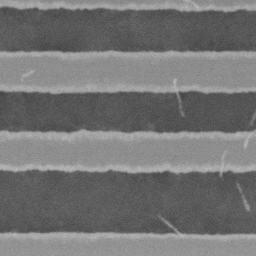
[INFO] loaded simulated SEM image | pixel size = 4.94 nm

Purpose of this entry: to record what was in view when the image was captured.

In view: lines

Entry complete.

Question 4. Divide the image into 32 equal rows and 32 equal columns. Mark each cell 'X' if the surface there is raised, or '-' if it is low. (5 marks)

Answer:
XXXXXXXXXXXXXXXXXXXXXXXXXXXXXXXX
--------------------------------
--------------------------------
--------------------------------
--------------------------------
--------------------------------
-----XXX-----XX------X------X---
XXXXXXXXXXXXXXXXXXXXXXXXXXXXXXXX
XXXXXXXXXXXXXXXXXXXXXXXXXXXXXXXX
XXXXXXXXXXXXXXXXXXXXXXXXXXXXXXXX
XXXXXXXXXXXXXXXXXXXXXXXXXXXXXXXX
------XXXX---------XX-X--XX-XXX-
--------------------------------
--------------------------------
--------------------------------
--------------------------------
X---------XX---------------X--XX
XXXXXXXXXXXXXXXXXXXXXXXXXXXXXXXX
XXXXXXXXXXXXXXXXXXXXXXXXXXXXXXXX
XXXXXXXXXXXXXXXXXXXXXXXXXXXXXXXX
XXXXXXXXXXXXXXXXXXXXXXXXXXXXXXXX
----------------X-----X---------
--------------------------------
--------------------------------
--------------------------------
--------------------------------
--------------------------------
--------------------------------
--------------------------------
XXXXXXXXXXXXXXXXXXXXXXXXXXXXXXXX
XXXXXXXXXXXXXXXXXXXXXXXXXXXXXXXX
XXXXXXXXXXXXXXXXXXXXXXXXXXXXXXXX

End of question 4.